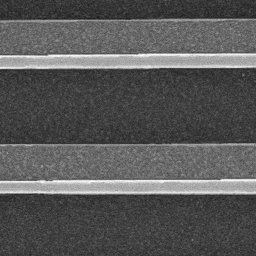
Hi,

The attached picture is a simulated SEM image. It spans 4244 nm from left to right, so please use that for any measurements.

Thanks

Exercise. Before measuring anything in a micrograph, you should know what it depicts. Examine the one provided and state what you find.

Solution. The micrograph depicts lines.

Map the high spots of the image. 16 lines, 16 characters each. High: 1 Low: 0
0000000000000000
1111111111111111
1111111111111111
1111111111111111
0000000000000000
0000000000000000
0000000000000000
0000000000000000
0000000000000000
1111111111111111
1111111111111111
1111111111111111
0000000000000000
0000000000000000
0000000000000000
0000000000000000